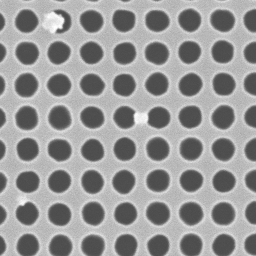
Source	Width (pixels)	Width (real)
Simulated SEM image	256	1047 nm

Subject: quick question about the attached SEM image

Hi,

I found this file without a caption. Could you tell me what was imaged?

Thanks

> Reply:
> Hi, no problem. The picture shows a regular array of holes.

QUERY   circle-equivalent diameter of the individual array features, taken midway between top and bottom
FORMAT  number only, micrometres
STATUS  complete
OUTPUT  0.0922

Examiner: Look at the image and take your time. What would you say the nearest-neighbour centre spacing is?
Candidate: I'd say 130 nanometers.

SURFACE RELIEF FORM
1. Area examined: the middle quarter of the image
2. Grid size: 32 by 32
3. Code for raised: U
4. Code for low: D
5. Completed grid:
UUUUUUUUUUUUUUUUUUUUUUUUUUUUUUUU
UUUUUUUUUUUUUUUUUUUUUUUUUUUUUUUU
UUUUUUDUUUUUUUUUUUUUUUDDDUUUUUUD
DUUUUDDDDUUUUDDDDUUUUDDDDDUUUDDD
DDUUDDDDDDUUDDDDDDUUUDDDDDUUUDDD
DDUUDDDDDDUUDDDDDDUUDDDDDDUUUDDD
DUUUUDDDDDUUDDDDDUUUUDDDDDUUUDDD
DUUUUDDDDUUUUDDDDUUUUUDDDUUUUUDD
UUUUUUUUUUUUUUUUUUUUUUUUUUUUUUUU
UUUUUUUUUUUUUUUUUUUUUUUUUUUUUUUU
UUUUUUDUUUUUUUUDUUUUUUUUUUUUUUUD
DUUUUDDDDUUUUDDDDUUUUUDDDDUUUDDD
DUUUDDDDDDUUUDDDDDUUUDDDDDUUUDDD
DDUUDDDDDDUUDDDDDDUUUDDDDDDUUDDD
DDUUUDDDDDUUUDDDDDUUUDDDDDUUUDDD
DUUUUUDDDUUUUUDDDUUUUUDDDUUUUUDD
UUUUUUUUUUUUUUUUUUUUUUUUUUUUUUUU
UUUUUUUUUUUUUUUUUUUUUUUUUUUUUUUU
UUUUUUUUUUUUUUDDUUUUUUUDUUUUUUUD
DUUUUUDDDUUUUDDDDUUUUDDDDDUUUUDD
DUUUUDDDDDUUUDDDDDUUUDDDDDUUUDDD
DDUUDDDDDDUUDDDDDDUUUDDDDDUUUDDD
DDUUUDDDDDUUUDDDDDUUUDDDDDUUUDDD
DUUUUDDDDUUUUDDDDUUUUUDDDUUUUUDD
UUUUUUUUUUUUUUUUUUUUUUUUUUUUUUUU
UUUUUUUUUUUUUUUUUUUUUUUUUUUUUUUU
UUUUUUUUUUUUUUDDUUUUUUUDDUUUUUUD
DUUUUDDDDUUUUDDDDUUUUDDDDDUUUUDD
DDUUDDDDDDUUDDDDDDUUUDDDDDUUUDDD
DDUUDDDDDDUUDDDDDDUUUDDDDDUUUDDD
DDUUUDDDDDUUDDDDDDUUUDDDDDUUUDDD
DUUUUDDDDUUUUDDDDUUUUUDDDUUUUUDD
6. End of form